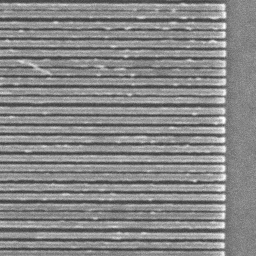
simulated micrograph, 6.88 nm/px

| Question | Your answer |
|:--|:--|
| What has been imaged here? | parallel lines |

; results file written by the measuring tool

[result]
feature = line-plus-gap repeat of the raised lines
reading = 65.5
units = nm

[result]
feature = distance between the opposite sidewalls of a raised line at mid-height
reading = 0.0413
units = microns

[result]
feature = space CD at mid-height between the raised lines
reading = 24.1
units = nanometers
